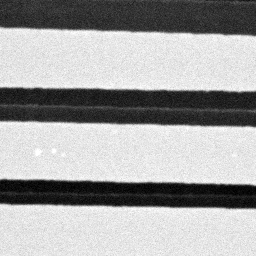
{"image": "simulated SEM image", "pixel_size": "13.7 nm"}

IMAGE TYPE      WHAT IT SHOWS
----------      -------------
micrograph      lines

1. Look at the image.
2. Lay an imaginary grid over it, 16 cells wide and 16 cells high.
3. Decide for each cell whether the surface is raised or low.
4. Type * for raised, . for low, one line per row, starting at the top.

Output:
................
................
****************
****************
****************
......**********
................
................
****************
****************
****************
...............*
................
****************
****************
****************